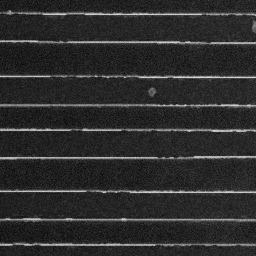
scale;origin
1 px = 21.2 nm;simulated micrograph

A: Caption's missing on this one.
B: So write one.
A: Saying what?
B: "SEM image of lines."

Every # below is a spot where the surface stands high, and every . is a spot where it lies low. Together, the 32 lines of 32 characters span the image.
################################
################################
................................
................................
................................
################################
################################
################################
################################
.......#########################
................................
................................
................................
################################
################################
################################
................................
................................
................................
................................
################################
################################
################################
################################
................................
................................
................................
################################
################################
################################
################################
................................